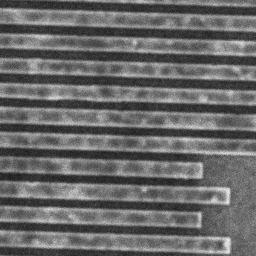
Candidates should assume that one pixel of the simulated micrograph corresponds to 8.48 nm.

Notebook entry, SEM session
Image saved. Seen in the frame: parallel lines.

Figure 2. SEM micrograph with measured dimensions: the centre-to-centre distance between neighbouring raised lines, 0.209 µm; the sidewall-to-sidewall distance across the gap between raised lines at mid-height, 87.9 nm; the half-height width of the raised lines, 14.6 px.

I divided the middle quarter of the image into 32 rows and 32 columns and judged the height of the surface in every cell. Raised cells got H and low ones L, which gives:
HHHHHHHHHHHHHHHHHHHHHHHHHHHHHHHH
HHHHHHHHHHHHHHHHHHHHHHHHHHHHHHHH
LHHHHHHHHHHHHHHHHHHHHHHHHHHHHHHH
LLLLLLLLLLLLLLLLLLLLLLLLLLLLLLLL
LLLLLLLLLLLLLLLLLLLLLLLLLLLLLLLL
LLLLLLHLLLLLLLLLLLLLLLLLLLLLLLLL
HHHHHHHHHHHHHHHHHHHHHHHHHHHHHHHH
HHHHHHHHHHHHHHHHHHHHHHHHHHHHHHHH
HHHHHHHHHHHHHHHHHHHHHHHHHHHHHHHH
LLLLLLLLLLLLLLLLLLLLLLLLLHHHHHLL
LLLLLLLLLLLLLLLLLLLLLLLLLLLLLLLL
HHHHHLLLLLLLLLLLLLLLLLLLLLLLLLLL
HHHHHHHHHHHHHHHHHHHHHHHHHHHHHHHH
HHHHHHHHHHHHHHHHHHHHHHHHHHHHHHHH
HHHHHHHHHHHHHHHHHHHHHHHHHHHHHHHH
LLLLLLLLLLLLLLLLLHHHHHHHHHHHHHHH
LLLLLLLLLLLLLLLLLLLLLLLLLLLLLLLL
LLLLLLLLLLLLLLLLLLLLLLLLLLLLLLLL
HHHHHHHHHHHHHHHHHHHHHHHLLLLLLLLL
HHHHHHHHHHHHHHHHHHHHHHHHHHHHHHHH
HHHHHHHHHHHHHHHHHHHHHHHHHHHHHHHH
LLLLLLLLLLLLLLLLHHHHHHHHHHHHHHHH
LLLLLLLLLLLLLLLLLLLLLLLLLLLLLLLL
LLLLLLLLLLLLLLLLLLLLLLLLLLLLLLLL
HHHHHHHHHHHHHHHHHHHHHHLLLLLLLLLL
HHHHHHHHHHHHHHHHHHHHHHHHHHHHHHHH
HHHHHHHHHHHHHHHHHHHHHHHHHHHHHHHH
LLLLLLLLHHHHHHHHHHHHHHHHHHHHHHHH
LLLLLLLLLLLLLLLLLLLLLLLLLLLLLLLL
LLLLLLLLLLLLLLLLLLLLLLLLLLLLLLLL
HHHHHHHHHHHHHHLLLLLLLLLLLLLLLLLL
HHHHHHHHHHHHHHHHHHHHHHHHHHHHHHHH